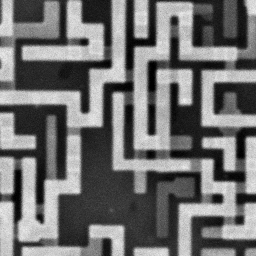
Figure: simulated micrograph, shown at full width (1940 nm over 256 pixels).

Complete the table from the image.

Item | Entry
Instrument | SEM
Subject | wiring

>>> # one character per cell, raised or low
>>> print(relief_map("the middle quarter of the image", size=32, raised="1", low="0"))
00000000000011100011100000000000
00000001111111100011100000000000
00000001111111100011100111111111
00000001111111100011100111111111
00000001110000000011100111101111
00000001110000000011100111000111
00000001110000000011100111000111
11110001110001100011100111000111
11110001100011100011100111000111
11110001100011100011100111000111
01110001100011100011100111000000
01110001100011100011100111000000
01111011100011100011100111000000
01111111100001100011100111000000
01111111100001100011100111000000
01111111100001100011100111000000
00000000000011100011100111000000
00000000000011100011100111000000
01110000000011100011111111000000
01110000000011100011111111000000
01110000000011100011111111000000
01110000000011100000000000000000
01110000000011100000000000000000
01110000000011100000000000000000
01110000000011111111111111111110
01110000000011111111111111111110
01110000000000000000000000000000
01110000000000000000000000000000
01110000000000000000000000000000
11110000000000000000000000000000
11110000000000000000000000000000
11110000000000000000000000000000